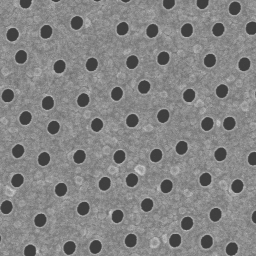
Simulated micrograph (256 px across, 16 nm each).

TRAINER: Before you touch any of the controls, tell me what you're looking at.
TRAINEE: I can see a regular array of holes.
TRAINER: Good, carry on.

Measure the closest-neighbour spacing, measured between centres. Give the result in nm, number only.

450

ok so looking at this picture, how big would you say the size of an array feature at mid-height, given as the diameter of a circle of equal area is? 0.213 micrometres